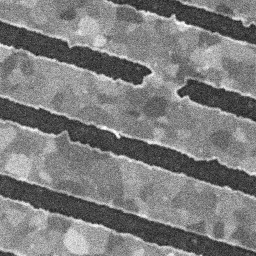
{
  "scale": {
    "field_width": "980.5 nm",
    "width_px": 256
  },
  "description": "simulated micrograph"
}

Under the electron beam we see one or a few lines or trenches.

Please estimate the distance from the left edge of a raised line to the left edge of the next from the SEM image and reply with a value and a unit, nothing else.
72.5 pixels